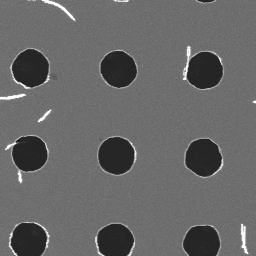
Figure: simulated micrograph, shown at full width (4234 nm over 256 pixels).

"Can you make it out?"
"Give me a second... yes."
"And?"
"holes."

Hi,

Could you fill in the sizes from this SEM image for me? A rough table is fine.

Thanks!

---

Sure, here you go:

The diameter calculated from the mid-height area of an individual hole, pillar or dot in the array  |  608 nanometres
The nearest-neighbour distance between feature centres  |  1.42 µm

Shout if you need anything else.